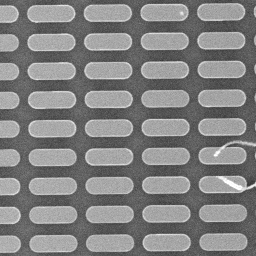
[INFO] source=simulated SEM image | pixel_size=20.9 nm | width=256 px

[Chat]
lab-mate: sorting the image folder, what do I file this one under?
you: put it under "groups of lines, slits or small figures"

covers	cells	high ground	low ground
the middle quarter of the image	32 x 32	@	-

@@---@@@@@@@@@@@@---@@@@@@@@@@@-
@@@--@@@@@@@@@@@@--@@@@@@@@@@@@-
@@@--@@@@@@@@@@@@---@@@@@@@@@@@-
@@----@@@@@@@@@@----------------
--------------------------------
--------------------------------
--------------------------------
@@----@@@@@@@@@@@---@@@@@@@@@@@-
@@@--@@@@@@@@@@@@---@@@@@@@@@@@-
@@@--@@@@@@@@@@@@---@@@@@@@@@@@-
@@----@@@@@@@@@@-----@@@@@@@@@--
--------------------------------
--------------------------------
--------------------------------
@@----@@@@@@@@@@----@@@@@@@@@@@-
@@@--@@@@@@@@@@@@---@@@@@@@@@@@-
@@@--@@@@@@@@@@@@---@@@@@@@@@@@-
@@----@@@@@@@@@@@---@@@@@@@@@@--
--------------------------------
--------------------------------
--------------------------------
@@-----@@@@@@@@@-----@@@@@@@@@@-
@@@--@@@@@@@@@@@@---@@@@@@@@@@@-
@@@--@@@@@@@@@@@@---@@@@@@@@@@@-
@@@---@@@@@@@@@@@---@@@@@@@@@@@-
--------------------------------
--------------------------------
--------------------------------
@@-----@@@@@@@@@-----@@@@@@@@@@-
@@@---@@@@@@@@@@@---@@@@@@@@@@@-
@@@--@@@@@@@@@@@@---@@@@@@@@@@@-
@@@---@@@@@@@@@@@---@@@@@@@@@@@-